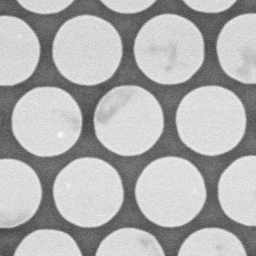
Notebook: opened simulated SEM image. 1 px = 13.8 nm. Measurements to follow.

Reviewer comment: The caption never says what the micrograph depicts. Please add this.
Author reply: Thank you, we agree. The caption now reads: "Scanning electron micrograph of an array of small figures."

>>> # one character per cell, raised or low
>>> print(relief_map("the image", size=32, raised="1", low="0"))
00011111100001111110000111111000
00001110000000011000000000000000
11100000011110000001111000000111
11110000111111000011111110001111
11110001111111100111111110011111
11111001111111100111111110011111
11111001111111100111111110011111
11111001111111100111111110011111
11110001111111100111111110001111
11110000111111000011111100000111
11000000001100000000000000000000
00001111000000111100000011111000
00011111100001111110000111111100
00111111110011111111001111111100
00111111110011111111001111111110
00111111110011111111001111111110
00111111110011111111001111111100
00111111110011111111000111111100
00011111100001111110000011111000
00000000000000000000000000000000
11100000011110000001111100000111
11110000111111100011111110001111
11111001111111100111111110011111
11111001111111100111111111011111
11111001111111100111111111011111
11111001111111100111111110001111
11110001111111100011111110001111
11100000111111000001111100000111
00000000000000000000000000000000
00011111100000111110000011111000
00011111100001111111000111111100
00111111110011111111001111111110